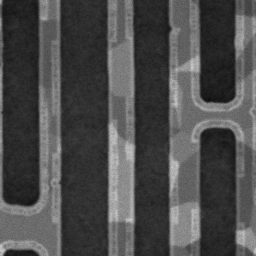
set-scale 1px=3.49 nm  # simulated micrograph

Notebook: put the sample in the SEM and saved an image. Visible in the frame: one or a few lines or trenches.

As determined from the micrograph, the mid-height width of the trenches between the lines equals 137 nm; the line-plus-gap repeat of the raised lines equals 235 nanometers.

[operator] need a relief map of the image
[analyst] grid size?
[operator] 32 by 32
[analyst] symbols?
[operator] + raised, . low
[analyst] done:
.....++.......++.....++++.....++
.....++.......+++....++++.....++
.....++.......+++....++++.....++
.....++.......+++.....+++.....++
.....++.......+++....++++.....++
.....++.......++.....++++....+++
.....++.......++.....++++.....++
.....++.......++.....++++.....++
.....++.......++.....++++.....++
.....++.......++.....++++.....++
.....++.......++.....++++.....++
.....++.......++.....++++.....++
.....++.......+++....++++....+++
.....++.......+++....+++++++++++
.....++.......+++....+++++++++++
.....++.......+++....+++++++++++
.....++.......+++....++++....+++
.....++.......+++....++++.....++
.....++.......+++....++++.....++
.....++.......+++....++++.....++
.....++.......+++....++++.....++
.....++.......+++....++++.....++
.....++.......+++....++++.....++
.....++.......+++....++++.....++
.....++.......+++....++++.....++
+....++.......++.....++++.....++
+++++++.......++.....++++.....++
+++++++.......++.....++++.....++
+++++++.......+++....++++.....++
+++++++.......+++.....+++.....++
+++++++.......+++.....+++.....++
.....++.......+++.....+++.....++